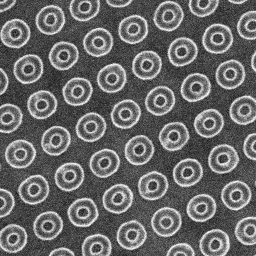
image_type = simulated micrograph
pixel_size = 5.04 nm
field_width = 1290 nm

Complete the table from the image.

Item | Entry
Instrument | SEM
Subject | a regular array of ring-shaped raised bodies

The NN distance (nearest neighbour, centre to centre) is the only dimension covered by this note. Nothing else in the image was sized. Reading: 187 nm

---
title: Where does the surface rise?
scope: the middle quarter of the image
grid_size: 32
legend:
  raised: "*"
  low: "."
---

**.........***...**...**........
.........******..***.***........
.........******...*****.........
........***..**....***.........*
.*****...**..**...............**
*******..******...............**
**...**...****........*****..***
**..***..............******...**
******...............**..***..**
.*****........***...***..***....
.............*****...***.**.....
............***.***..*****......
......**....**...**....**.......
....******..***.***.............
....******..******..............
...**...**...****........*****..
...***..**..............*******.
*..*******..............**...**.
*...*****........****...**...**.
*...............******..*******.
*...............**..**...*****..
..........*....**...**....**....
........*****..***.***..........
.......***.***..*****...........
.......**..***..*****........***
****...**..***..............****
*****..******...............**..
...**...****.........***...***..
..***..............******...****
****...............**..***..****
****.........**....**..***......
**.........*****...**..***......